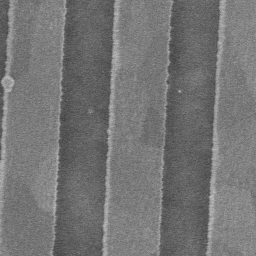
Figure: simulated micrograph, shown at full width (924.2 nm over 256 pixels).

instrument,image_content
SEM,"lines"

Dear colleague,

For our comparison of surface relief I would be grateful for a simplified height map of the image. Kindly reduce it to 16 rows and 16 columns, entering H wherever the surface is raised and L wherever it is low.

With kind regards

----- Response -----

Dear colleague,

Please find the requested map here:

LHHHLLLHHHHLLLHH
LHHHLLLHHHHLLLHH
HHHHLLLHHHHLLLHH
HHHHLLLHHHHLLLHH
HHHHLLLHHHLLLLHH
HHHHLLLHHHLLLLHH
HHHHLLLHHHLLLHHH
HHHHLLLHHHLLLHHH
HHHHLLLHHHLLLHHH
HHHHLLLHHHLLLHHH
HHHHLLLHHHLLLHHH
HHHHLLLHHHLLLHHH
HHHLLLLHHHLLLHHH
HHHLLLLHHHLLLHHH
HHHLLLHHHHLLLHHH
HHHLLLHHHHLLLHHH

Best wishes